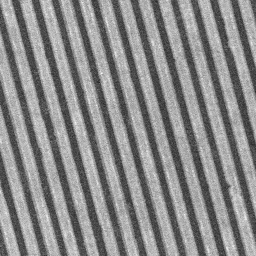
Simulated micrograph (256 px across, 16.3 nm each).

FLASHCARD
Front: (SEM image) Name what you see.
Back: parallel lines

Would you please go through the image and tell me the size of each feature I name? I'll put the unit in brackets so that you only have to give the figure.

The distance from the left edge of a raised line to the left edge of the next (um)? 0.312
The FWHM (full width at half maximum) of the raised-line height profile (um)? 0.13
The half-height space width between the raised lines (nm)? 187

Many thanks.